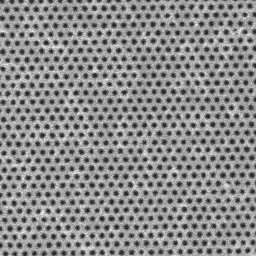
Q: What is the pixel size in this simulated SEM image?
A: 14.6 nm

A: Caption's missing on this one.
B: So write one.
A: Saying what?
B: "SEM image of a regular array of holes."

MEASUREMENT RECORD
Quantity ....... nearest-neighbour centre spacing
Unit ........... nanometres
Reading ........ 137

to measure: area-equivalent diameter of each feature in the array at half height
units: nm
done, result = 90.5